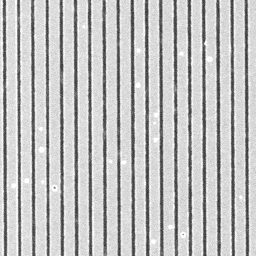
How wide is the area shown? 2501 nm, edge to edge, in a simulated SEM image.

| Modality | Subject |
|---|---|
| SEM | parallel lines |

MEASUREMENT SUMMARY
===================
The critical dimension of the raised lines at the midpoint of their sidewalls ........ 0.0965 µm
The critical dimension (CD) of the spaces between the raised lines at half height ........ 41.5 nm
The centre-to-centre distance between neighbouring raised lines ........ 139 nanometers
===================